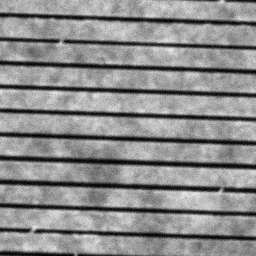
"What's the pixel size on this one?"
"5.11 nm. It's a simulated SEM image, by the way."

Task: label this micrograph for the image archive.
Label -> parallel lines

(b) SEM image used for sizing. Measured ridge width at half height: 91.8 nanometres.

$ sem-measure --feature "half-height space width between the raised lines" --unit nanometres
30.6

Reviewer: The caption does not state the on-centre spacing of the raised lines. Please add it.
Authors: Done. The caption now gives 122 nm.